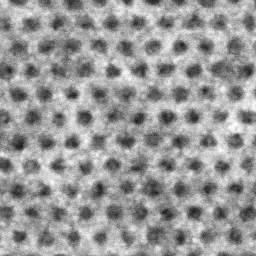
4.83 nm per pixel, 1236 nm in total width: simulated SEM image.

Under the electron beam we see a regular array of raised bodies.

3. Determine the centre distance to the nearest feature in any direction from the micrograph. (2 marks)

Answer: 0.127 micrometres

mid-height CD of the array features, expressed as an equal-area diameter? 59.2 nanometres